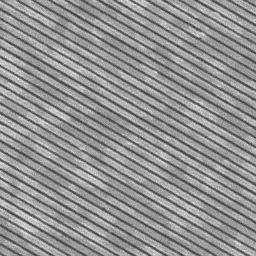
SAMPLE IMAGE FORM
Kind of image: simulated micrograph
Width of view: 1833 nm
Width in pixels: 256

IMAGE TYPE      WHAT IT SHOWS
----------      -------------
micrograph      parallel lines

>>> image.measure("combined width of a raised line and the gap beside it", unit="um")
0.0582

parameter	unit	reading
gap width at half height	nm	20.1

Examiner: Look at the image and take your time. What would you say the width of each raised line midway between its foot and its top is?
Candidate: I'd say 39.5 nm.